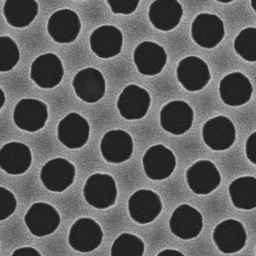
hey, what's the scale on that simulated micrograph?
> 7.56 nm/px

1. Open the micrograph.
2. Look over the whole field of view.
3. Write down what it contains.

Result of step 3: a regular array of holes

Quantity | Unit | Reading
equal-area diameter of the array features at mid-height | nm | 254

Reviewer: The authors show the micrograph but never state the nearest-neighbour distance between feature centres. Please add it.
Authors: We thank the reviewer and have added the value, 0.342 micrometres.